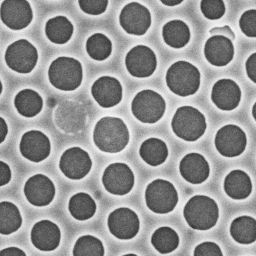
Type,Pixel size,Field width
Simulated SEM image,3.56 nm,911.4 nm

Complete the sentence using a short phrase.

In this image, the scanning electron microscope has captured a regular array of holes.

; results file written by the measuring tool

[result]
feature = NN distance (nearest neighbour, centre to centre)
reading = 155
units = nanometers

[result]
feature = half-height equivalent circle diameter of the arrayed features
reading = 0.114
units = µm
